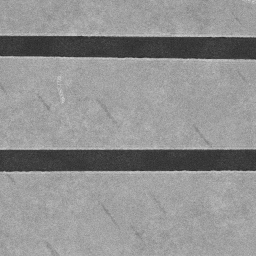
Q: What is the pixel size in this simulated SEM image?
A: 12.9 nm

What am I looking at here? lines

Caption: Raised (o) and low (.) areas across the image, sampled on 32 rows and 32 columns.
oooooooooooooooooooooooooooooooo
oooooooooooooooooooooooooooooooo
oooooooooooooooooooooooooooooooo
oooooooooooooooooooooooooooooooo
...........ooooooooooooooooooooo
................................
................................
oooooooooooooooooooooooooooooooo
oooooooooooooooooooooooooooooooo
oooooooooooooooooooooooooooooooo
oooooooooooooooooooooooooooooooo
oooooooooooooooooooooooooooooooo
oooooooooooooooooooooooooooooooo
oooooooooooooooooooooooooooooooo
oooooooooooooooooooooooooooooooo
oooooooooooooooooooooooooooooooo
oooooooooooooooooooooooooooooooo
oooooooooooooooooooooooooooooooo
oooooooooooooooooooooooooooooooo
................................
................................
oooooooooooooooooooooooooooooooo
oooooooooooooooooooooooooooooooo
oooooooooooooooooooooooooooooooo
oooooooooooooooooooooooooooooooo
oooooooooooooooooooooooooooooooo
oooooooooooooooooooooooooooooooo
oooooooooooooooooooooooooooooooo
oooooooooooooooooooooooooooooooo
oooooooooooooooooooooooooooooooo
oooooooooooooooooooooooooooooooo
oooooooooooooooooooooooooooooooo